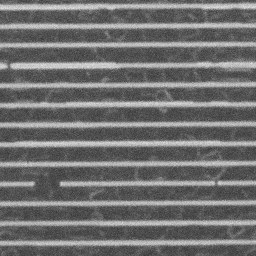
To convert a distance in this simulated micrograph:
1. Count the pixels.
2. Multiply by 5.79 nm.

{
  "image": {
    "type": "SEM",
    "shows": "parallel lines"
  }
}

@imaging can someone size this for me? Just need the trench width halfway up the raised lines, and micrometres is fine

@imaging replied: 0.0912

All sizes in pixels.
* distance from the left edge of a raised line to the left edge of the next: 19.7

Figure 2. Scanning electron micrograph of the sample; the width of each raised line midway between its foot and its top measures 0.0232 um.